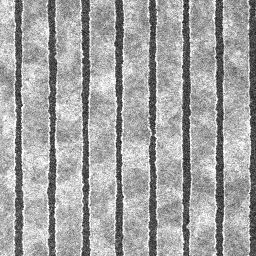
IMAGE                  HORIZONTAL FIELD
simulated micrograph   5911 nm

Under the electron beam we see parallel lines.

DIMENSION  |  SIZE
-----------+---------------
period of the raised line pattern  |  774 nanometers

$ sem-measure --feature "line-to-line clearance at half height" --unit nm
182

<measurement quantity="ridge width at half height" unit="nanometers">586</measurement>